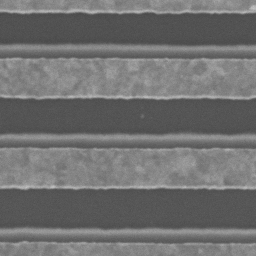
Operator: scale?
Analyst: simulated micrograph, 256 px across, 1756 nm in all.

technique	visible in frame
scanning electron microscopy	lines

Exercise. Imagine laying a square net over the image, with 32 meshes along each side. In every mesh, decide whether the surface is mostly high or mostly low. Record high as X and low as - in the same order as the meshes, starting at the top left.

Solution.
XXXXXXXXXXXXXXXXXXXXXXXXXXXXXXXX
-XXXXXXXX-XXXXXXXX-XXXXXXXXXXXXX
--------------------------------
--------------------------------
--------------------------------
--------------------------------
--------------------------------
XXXXXXXXXXXXXXXXXXXXXXXXXXXXXXXX
XXXXXXXXXXXXXXXXXXXXXXXXXXXXXXXX
XXXXXXXXXXXXXXXXXXXXXXXXXXXXXXXX
XXXXXXXXXXXXXXXXXXXXXXXXXXXXXXXX
XXXXXXXXXXXXXXXXXXXXXXXXXXXXXXXX
--------------------------------
--------------------------------
--------------------------------
--------------------------------
--------------------------------
--------------------------------
---X----------------------------
XXXXXXXXXXXXXXXXXXXXXXXXXXXXXXXX
XXXXXXXXXXXXXXXXXXXXXXXXXXXXXXXX
XXXXXXXXXXXXXXXXXXXXXXXXXXXXXXXX
XXXXXXXXXXXXXXXXXXXXXXXXXXXXXXXX
XXXXXXXXXXXXXXXXXXXXXXXXXXXXXXXX
--------------------------------
--------------------------------
--------------------------------
--------------------------------
--------------------------------
--------------------------------
XXXXXXXXXXXXXXXXXXXXX--XXXX--X-X
XXXXXXXXXXXXXXXXXXXXXXXXXXXXXXXX